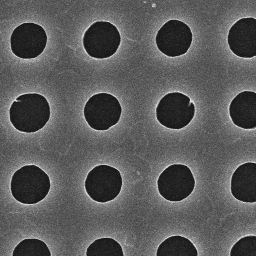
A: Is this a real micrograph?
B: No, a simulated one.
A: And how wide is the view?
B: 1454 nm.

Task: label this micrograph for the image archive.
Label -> a regular array of holes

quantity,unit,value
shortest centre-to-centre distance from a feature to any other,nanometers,409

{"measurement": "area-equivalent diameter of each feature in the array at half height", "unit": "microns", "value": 0.211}